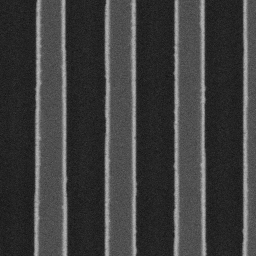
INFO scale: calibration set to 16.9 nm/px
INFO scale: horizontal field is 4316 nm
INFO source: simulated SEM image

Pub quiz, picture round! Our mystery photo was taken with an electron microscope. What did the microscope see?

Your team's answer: lines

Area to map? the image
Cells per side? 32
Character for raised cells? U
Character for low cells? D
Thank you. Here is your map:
DDDDDUUUDDDDDUUUUDDDDDUUUUDDDDUU
DDDDDUUUDDDDDUUUUDDDDDUUUUDDDDUU
DDDDDUUUDDDDDUUUUDDDDDUUUUDDDDUU
DDDDDUUUDDDDDUUUUDDDDDUUUUDDDDUU
DDDDDUUUDDDDDUUUUDDDDDUUUUDDDDUU
DDDDDUUUDDDDDUUUUDDDDDUUUUDDDDUU
DDDDDUUUDDDDDUUUUDDDDDUUUUDDDDDU
DDDDDUUUDDDDDUUUUDDDDDUUUUDDDDUU
DDDDDUUUDDDDDUUUUDDDDDUUUUDDDDUU
DDDDDUUUDDDDDUUUUDDDDDUUUUDDDDUU
DDDDDUUUDDDDDUUUUDDDDDUUUUDDDDUU
DDDDDUUUDDDDDUUUUDDDDDUUUUDDDDUU
DDDDDUUUDDDDDUUUUDDDDDUUUUDDDDUU
DDDDDUUUDDDDDUUUUDDDDDUUUUDDDDUU
DDDDUUUUDDDDDUUUUDDDDDUUUUDDDDUU
DDDDUUUUDDDDDUUUUDDDDDUUUUDDDDUU
DDDDUUUUDDDDDUUUUDDDDDUUUUDDDDUU
DDDDUUUUDDDDDUUUUDDDDDUUUUDDDDUU
DDDDUUUUDDDDDUUUUDDDDDUUUUDDDDUU
DDDDUUUUDDDDDUUUUDDDDDUUUUDDDDUU
DDDDUUUUDDDDDUUUUDDDDDUUUUDDDDUU
DDDDUUUUDDDDDUUUUDDDDDUUUUDDDDUU
DDDDUUUUDDDDDUUUUDDDDDUUUUDDDDUU
DDDDUUUUDDDDDUUUUDDDDDUUUUDDDDUU
DDDDUUUUDDDDDUUUUDDDDDUUUUDDDDUU
DDDDUUUUDDDDDUUUUDDDDDUUUUDDDDUU
DDDDUUUUDDDDDUUUUDDDDDUUUUDDDDUU
DDDDUUUUDDDDDUUUUDDDDDUUUUDDDDUU
DDDDUUUUDDDDDUUUUDDDDDUUUUDDDDUU
DDDDUUUUDDDDDUUUUDDDDDUUUUDDDDUU
DDDDUUUUDDDDDUUUUDDDDDUUUUDDDDUU
DDDDUUUUDDDDDUUUUDDDDDUUUUDDDDUU